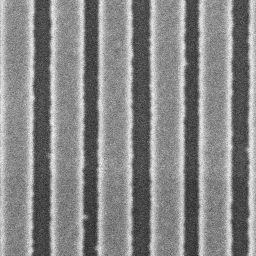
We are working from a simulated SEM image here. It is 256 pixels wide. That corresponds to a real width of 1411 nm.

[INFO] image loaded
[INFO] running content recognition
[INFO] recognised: lines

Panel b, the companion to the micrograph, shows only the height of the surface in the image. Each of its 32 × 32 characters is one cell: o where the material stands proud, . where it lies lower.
oooo..oooo..oooo...oooo..oooo..o
oooo..oooo..oooo...oooo..oooo..o
oooo..oooo..oooo...oooo..oooo..o
oooo..ooooo.oooo...oooo..oooo..o
oooo..oooo..oooo...oooo..oooo..o
oooo..oooo..oooo...oooo..oooo..o
oooo..oooo..ooooo..oooo..oooo..o
oooo..oooo..oooo...oooo..oooo..o
oooo..oooo..oooo...oooo..oooo..o
oooo..oooo..oooo...oooo..oooo..o
oooo..oooo..oooo...oooo..oooo..o
oooo..oooo..oooo...oooo..oooo..o
oooo..oooo..oooo...oooo..oooo..o
oooo..oooo..oooo...oooo..oooo..o
oooo..oooo..ooooo..oooo..oooo..o
oooo..oooo..ooooo..oooo..oooo..o
oooo..oooo..oooo...oooo..oooo..o
oooo..oooo..oooo...oooo..oooo..o
oooo..oooo..oooo...oooo..oooo..o
oooo..oooo..ooooo..oooo..oooo..o
oooo..oooo..oooo...oooo..oooo..o
oooo..oooo..oooo...oooo..oooo..o
oooo..oooo..oooo...oooo..oooo..o
oooo..oooo..oooo...oooo..oooo..o
oooo..oooo..oooo...oooo..oooo..o
oooo..oooo..oooo...oooo..oooo..o
oooo..oooo..oooo...oooo..oooo..o
oooo..oooo..oooo...oooo..oooo..o
oooo..oooo..oooo...oooo..oooo..o
oooo..oooo..oooo...oooo..oooo..o
oooo..oooo..oooo...oooo..oooo..o
oooo..oooo..oooo...oooo..oooo..o